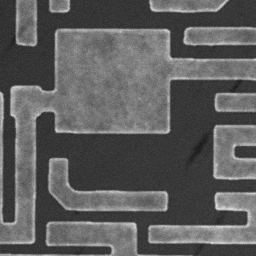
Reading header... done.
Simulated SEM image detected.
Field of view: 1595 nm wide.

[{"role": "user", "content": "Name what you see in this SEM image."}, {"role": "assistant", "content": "wiring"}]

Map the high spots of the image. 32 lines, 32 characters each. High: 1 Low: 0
00110011100000000001111111110000
00110000000000000000000000000000
00110000000000000000000000000000
00110000000000000000000011110000
00110001111111111111100111111111
00010001111111111111100000000000
00000001111111111111100000000000
00000001111111111111111100000000
00000001111111111111111111111111
00000001111111111111111111111111
00000001111111111111100000000000
01111111111111111111100000000000
01111111111111111111100000011111
01111111111111111111100000011111
00111001111111111111100000000000
00110001111111111111100000000000
00110000011111111111100000011111
00110000000000000000000000011111
00110000000000000000000000011000
00110000000000000000000000011000
00110011000000000000000000011111
00110011000000000000000000011111
00110011000000000000000000000000
00110011100000000000000000000000
00110001111111111111100000011111
00110000111111111111100000011111
00110000000000000000000000000001
00110000000000000000000000000001
11110011111111111001111111111111
11110011111111111001111111111111
00000011111111111000000000000000
00000000000000111000000000000000